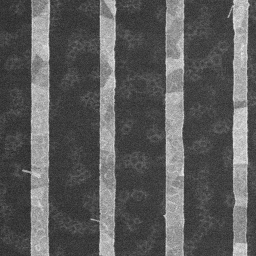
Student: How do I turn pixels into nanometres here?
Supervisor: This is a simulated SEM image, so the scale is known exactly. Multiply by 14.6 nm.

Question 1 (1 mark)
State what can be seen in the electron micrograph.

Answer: one or a few lines or trenches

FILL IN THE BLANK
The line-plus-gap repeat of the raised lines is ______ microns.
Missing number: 0.975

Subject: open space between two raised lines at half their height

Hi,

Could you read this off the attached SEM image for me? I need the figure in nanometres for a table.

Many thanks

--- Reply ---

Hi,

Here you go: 749